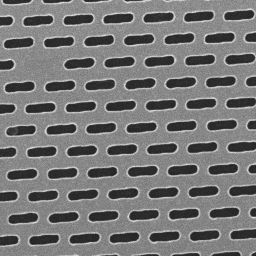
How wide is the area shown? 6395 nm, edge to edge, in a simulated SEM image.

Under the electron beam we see a regular array of holes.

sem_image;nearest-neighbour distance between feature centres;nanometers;736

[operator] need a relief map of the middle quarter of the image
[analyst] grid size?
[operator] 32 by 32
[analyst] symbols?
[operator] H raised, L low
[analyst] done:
LLLLLLLHHHLLLLLLLHHHHLLLLLHHHHHL
HHHHHHHHHHHHHHHHHHHHHHHHHHHHHHHH
HHHHHHHHHHHHHHHHHHHHHHHHHHHHHHHH
HHHHHHHHHHHHHHHHHHHHHLHHHHHHHLLL
LLHHHHHLLLLLLHHHLLLLLLLHHHLLLLLL
LLLHHLLLLLLLLHHLLLLLLLHHHLLLLLLL
LLHHHHLLHHHHHHHHHHHHHHHHHHHHHHHH
HHHHHHHHHHHHHHHHHHHHHHHHHHHHHHHH
HHHHHHHHHHHHHHHHHHHHHHHHHHHHHHHH
HHHHLLLHHHHHLLLLLLHHHLLLLLLLHHHL
LLLLLLLLHHHLLLLLLLHHHLLLLLLLHHHL
LLLLLLLHHHHLLLLLLHHHHLLLLHHHHHHH
HHHHHHHHHHHHHHHHHHHHHHHHHHHHHHHH
HHHHHHHHHHHHHHHHHHHHHHHHHHHHHHHH
HHHHHHHHHHHHHHHHHHHHHHHHHHHHLLLL
LLLHHHLLLLLLLHHHLLLLLLLHHHLLLLLL
LLLHHLLLLLLLLHHHLLLLLLLHHHLLLLLL
LHHHHHLLLHHHHHHHHHHHHHHHHHHHHHHH
HHHHHHHHHHHHHHHHHHHHHHHHHHHHHHHH
HHHHHHHHHHHHHHHHHHHHHHHHHHHHHHHH
HHHHLLLLHHHHLLLLLLHHHLLLLLLLHHHL
HLLLLLLLHHHLLLLLLLHHHLLLLLLLHHHL
HLLLLLLHHHHLLLLLLHHHHHLLHHHHHHHH
HHHHHHHHHHHHHHHHHHHHHHHHHHHHHHHH
HHHHHHHHHHHHHHHHHHHHHHHHHHHHHHHH
HHHHHHHHHHHHHHHHHHHHHLLHHHHLLLLL
LLLHHHLLLLLLLHHHLLLLLLLLHHLLLLLL
LLLHHHLLLLLLLHHHLLLLLLLHHHLLLLLL
LLHHHHHLLHHHHHHHHHHHHHHHHHHHHHHH
HHHHHHHHHHHHHHHHHHHHHHHHHHHHHHHH
HHHHHHHHHHHHHHHHHHHHHHHHHHHHHHHH
HHHHHLLLHHHHLLLLLLHHHHLLLLLLLHHL